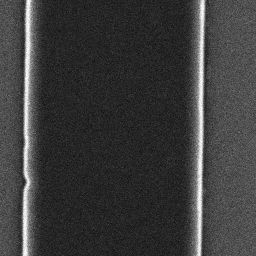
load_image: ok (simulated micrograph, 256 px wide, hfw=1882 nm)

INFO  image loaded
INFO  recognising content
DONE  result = one or a few lines or trenches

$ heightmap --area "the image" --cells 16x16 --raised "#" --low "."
..###########...
..###########...
..###########...
..###########...
..###########...
..###########...
..###########...
..###########...
..###########...
..###########...
..###########...
..###########...
..###########...
..##########....
..##########....
..##########....